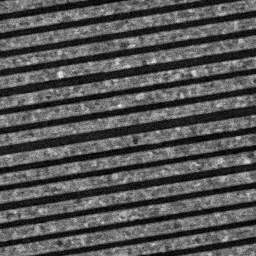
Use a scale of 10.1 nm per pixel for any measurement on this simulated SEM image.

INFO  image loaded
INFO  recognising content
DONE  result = parallel lines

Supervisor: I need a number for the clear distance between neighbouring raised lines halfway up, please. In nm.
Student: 88.1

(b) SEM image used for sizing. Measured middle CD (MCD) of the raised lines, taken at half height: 96.8 nanometres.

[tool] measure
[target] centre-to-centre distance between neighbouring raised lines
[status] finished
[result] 188 nm